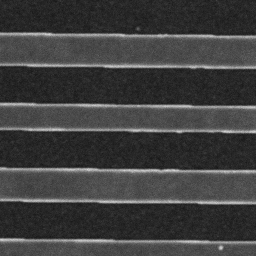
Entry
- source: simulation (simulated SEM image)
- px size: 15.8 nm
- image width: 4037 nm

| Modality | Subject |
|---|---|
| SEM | lines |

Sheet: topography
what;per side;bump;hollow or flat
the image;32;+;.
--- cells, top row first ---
................................
................................
................................
................................
+++++++++++++++++++++++++++.....
++++++++++++++++++++++++++++++++
++++++++++++++++++++++++++++++++
++++++++++++++++++++++++++++++++
..........................++++++
................................
................................
................................
................................
++++++++++++++++++++++++++++++++
++++++++++++++++++++++++++++++++
++++++++++++++++++++++++++++++++
............................++++
................................
................................
................................
................................
++++++++++++++++++++++++++++++++
++++++++++++++++++++++++++++++++
++++++++++++++++++++++++++++++++
++++++++++++++++++++++++++++++++
................................
................................
................................
................................
................................
++++++++++++++++++++++++++++++++
++++++++++++++++++++++++++++++++